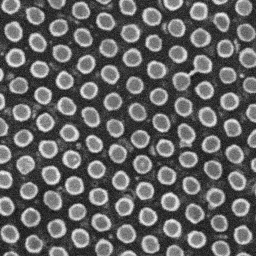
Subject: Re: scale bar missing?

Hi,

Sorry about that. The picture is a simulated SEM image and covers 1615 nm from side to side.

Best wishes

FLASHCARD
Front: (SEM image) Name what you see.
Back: a regular array of raised bodies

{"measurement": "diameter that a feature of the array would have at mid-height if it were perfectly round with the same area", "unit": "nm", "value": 105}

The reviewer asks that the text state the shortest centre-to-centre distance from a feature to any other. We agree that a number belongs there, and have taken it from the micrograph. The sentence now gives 164 nm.